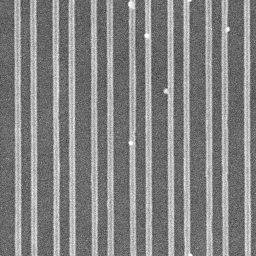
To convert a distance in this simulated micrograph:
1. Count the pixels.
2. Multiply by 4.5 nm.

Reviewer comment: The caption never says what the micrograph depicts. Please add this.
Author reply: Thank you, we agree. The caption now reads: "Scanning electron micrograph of parallel lines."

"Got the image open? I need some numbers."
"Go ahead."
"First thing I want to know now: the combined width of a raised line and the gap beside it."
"0.086 um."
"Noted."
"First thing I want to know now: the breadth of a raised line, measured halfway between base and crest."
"0.0236 um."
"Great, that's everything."